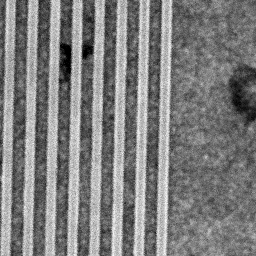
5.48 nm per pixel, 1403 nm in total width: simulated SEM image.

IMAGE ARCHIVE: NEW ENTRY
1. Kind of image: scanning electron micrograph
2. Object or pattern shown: parallel lines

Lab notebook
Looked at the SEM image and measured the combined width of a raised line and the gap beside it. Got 122 nm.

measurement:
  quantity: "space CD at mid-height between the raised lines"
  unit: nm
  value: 76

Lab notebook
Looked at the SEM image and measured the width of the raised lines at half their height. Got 47.3 nm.